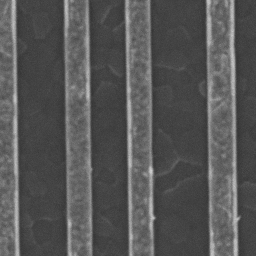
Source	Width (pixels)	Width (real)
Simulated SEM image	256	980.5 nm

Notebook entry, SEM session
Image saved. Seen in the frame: one or a few lines or trenches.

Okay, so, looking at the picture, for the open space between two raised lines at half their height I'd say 190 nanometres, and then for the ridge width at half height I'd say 23.5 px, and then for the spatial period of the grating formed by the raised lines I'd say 275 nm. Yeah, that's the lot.